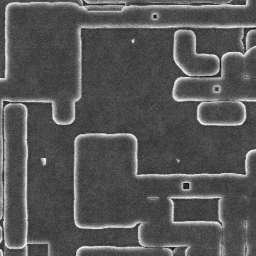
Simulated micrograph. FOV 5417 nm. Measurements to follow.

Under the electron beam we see wiring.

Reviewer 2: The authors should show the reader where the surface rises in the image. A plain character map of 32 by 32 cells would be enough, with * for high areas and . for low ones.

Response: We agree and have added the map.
.********......................*
.*******************************
.*******************************
.**********...........**........
.*********............**........
.*********............**........
.*********............***......*
.*********............**********
.*********.............*********
.*********.............*********
**********............**********
**********............**********
**********............**********
***....**................******.
***....**................******.
***.......................****..
***.............................
***......********...............
***......********...............
***......********..............*
***......********..............*
***......********..............*
***......***********************
***......**************.********
***......***********************
***......*************.....*****
***......*************.....*****
***......*************.....*****
***........**....***************
***..............***************
.**...............**************
..........***********..*********